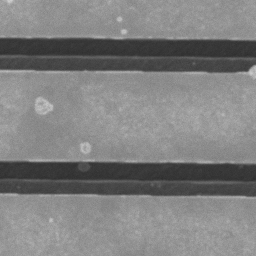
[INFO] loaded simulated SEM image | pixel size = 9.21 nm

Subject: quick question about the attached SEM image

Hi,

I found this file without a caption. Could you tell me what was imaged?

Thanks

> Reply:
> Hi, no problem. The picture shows lines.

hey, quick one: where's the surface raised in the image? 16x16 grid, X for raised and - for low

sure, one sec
XXXXXXXXXXXXXXXX
XXXXXXXXXXXXXXXX
----------------
----------------
XXXXXXXXX------X
XXXXXXXXXXXXXXXX
XXXXXXXXXXXXXXXX
XXXXXXXXXXXXXXXX
XXXXXXXXXXXXXXXX
XXXXXXXXXXXXXXXX
----------------
----------------
XXXXXXXXXXXXXXXX
XXXXXXXXXXXXXXXX
XXXXXXXXXXXXXXXX
XXXXXXXXXXXXXXXX